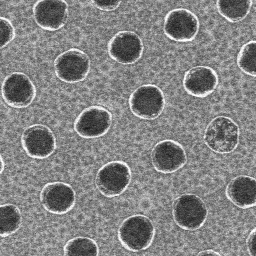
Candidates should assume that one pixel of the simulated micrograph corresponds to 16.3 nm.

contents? a regular array of raised bodies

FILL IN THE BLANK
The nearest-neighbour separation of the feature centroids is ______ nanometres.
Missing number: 930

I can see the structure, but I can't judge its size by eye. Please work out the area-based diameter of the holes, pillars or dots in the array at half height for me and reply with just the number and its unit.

33.7 pixels